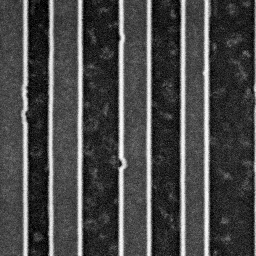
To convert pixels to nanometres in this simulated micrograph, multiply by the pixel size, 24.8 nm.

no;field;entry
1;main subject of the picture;one or a few lines or trenches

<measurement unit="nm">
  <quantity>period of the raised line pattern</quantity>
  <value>1600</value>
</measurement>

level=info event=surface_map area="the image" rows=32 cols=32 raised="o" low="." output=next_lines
ooo...oooo.....oooo....ooo......
ooo...oooo.....oooo....ooo......
ooo...oooo.....oooo....ooo......
ooo...oooo.....oooo....ooo......
ooo...oooo.....oooo....ooo......
ooo...oooo.....oooo....ooo......
ooo...oooo.....oooo....ooo......
ooo...oooo.....oooo....ooo......
ooo...oooo.....oooo....ooo......
ooo...oooo.....oooo....ooo......
ooo...oooo.....oooo....ooo......
ooo...oooo.....oooo....ooo......
ooo...oooo.....oooo....ooo......
ooo...oooo.....oooo....ooo......
ooo...oooo.....oooo....ooo......
ooo...oooo.....oooo....ooo......
ooo...oooo.....oooo....ooo......
ooo...oooo.....oooo....ooo......
ooo...oooo.....oooo....ooo......
ooo...oooo.....oooo....ooo......
ooo...oooo.....oooo....ooo......
ooo...oooo.....oooo....ooo......
ooo...oooo.....oooo....ooo......
ooo...oooo.....oooo....ooo......
ooo...oooo.....ooo.....ooo......
ooo...oooo.....ooo.....ooo......
ooo...oooo.....ooo.....ooo......
ooo...oooo.....ooo.....ooo......
ooo...oooo.....ooo.....ooo......
ooo...oooo.....ooo.....ooo......
ooo...oooo.....ooo.....ooo......
ooo...oooo.....ooo.....ooo......